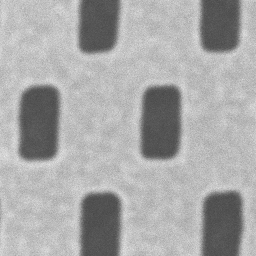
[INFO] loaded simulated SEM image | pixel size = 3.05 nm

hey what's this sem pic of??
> holes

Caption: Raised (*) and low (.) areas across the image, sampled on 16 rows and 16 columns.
*****...*****..*
*****..******..*
*****..******..*
****************
****************
**.******..*****
*...*****..*****
*...*****..*****
*...*****..*****
*...*****..*****
****************
****************
*****..******..*
*****...*****..*
*****...*****..*
*****...*****..*